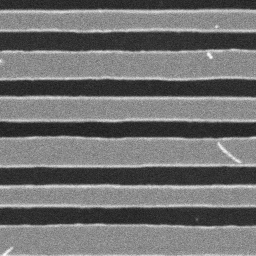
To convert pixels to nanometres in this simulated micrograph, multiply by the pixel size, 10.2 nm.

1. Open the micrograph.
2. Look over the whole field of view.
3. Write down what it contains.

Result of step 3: lines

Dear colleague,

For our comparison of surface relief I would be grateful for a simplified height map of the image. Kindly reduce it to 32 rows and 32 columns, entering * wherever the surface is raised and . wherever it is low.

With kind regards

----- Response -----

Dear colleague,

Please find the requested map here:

................................
********************************
********************************
********************************
................................
................................
*********.******.***************
********************************
********************************
********************************
................................
................................
********************************
********************************
********************************
................................
................................
********************************
********************************
********************************
********************************
................................
................................
********************************
********************************
********************************
................................
................................
********************************
********************************
********************************
********************************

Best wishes